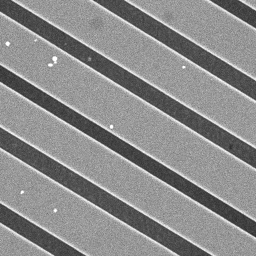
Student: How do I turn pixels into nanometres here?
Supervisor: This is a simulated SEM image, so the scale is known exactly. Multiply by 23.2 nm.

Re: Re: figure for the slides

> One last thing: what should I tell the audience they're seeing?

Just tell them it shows lines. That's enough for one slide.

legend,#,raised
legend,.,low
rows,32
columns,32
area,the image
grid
..##########....###########....#
....##########....###########...
##....##########....##########..
###....##########....###########
#####....##########....#########
#######...##########.....#######
########....##########....######
##########....##########....####
.##########....##########....###
..###########....##########....#
....###########....##########...
##....##########....##########..
####...###########....##########
#####....###########....########
#######...###########....#######
#########...###########....#####
.#########....##########....####
...#########...###########....##
....##########...###########....
##....#########....##########...
###.....#########...###########.
#####....#########....##########
#######....#########...#########
########.....#########...#######
##########....#########....#####
############....#########...####
..###########.....#########...##
....###########....#########....
#....############....#########..
###....###########.....#########
####....############....########
######....############....######